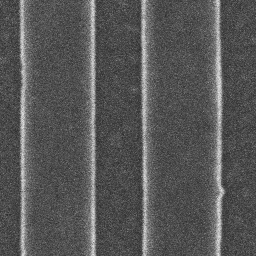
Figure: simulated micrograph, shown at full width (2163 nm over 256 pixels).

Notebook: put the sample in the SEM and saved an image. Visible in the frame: one or a few lines or trenches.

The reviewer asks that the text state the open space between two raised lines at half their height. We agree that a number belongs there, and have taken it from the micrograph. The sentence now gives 50.9 px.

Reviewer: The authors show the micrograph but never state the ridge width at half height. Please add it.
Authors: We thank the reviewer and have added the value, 613 nanometers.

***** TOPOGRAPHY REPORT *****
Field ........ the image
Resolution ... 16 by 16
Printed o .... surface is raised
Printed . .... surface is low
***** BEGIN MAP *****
.ooooo...ooooo..
.ooooo...ooooo..
.ooooo...ooooo..
.ooooo...ooooo..
.ooooo...ooooo..
.ooooo...ooooo..
.ooooo...ooooo..
.ooooo...ooooo..
.ooooo...ooooo..
.ooooo...ooooo..
.ooooo...ooooo..
.ooooo...ooooo..
.ooooo...ooooo..
.ooooo...ooooo..
.ooooo...ooooo..
.ooooo...ooooo..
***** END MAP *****